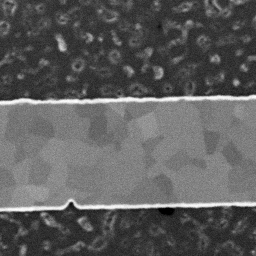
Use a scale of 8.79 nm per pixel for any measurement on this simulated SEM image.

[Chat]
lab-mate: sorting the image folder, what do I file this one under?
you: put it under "one or a few lines or trenches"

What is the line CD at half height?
941 nm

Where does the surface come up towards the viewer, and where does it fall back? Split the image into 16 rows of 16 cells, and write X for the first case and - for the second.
----------------
----------------
----------------
----------------
----------------
----------------
XXXXXXXXXXXXXXXX
XXXXXXXXXXXXXXXX
XXXXXXXXXXXXXXXX
XXXXXXXXXXXXXXXX
XXXXXXXXXXXXXXXX
XXXXXXXXXXXXXXXX
XXXXXXXXXXXXXXXX
----------------
----------------
----------------